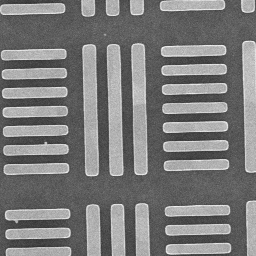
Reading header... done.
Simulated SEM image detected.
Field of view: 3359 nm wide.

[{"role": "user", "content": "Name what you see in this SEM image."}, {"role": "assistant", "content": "groups of lines, slits or small figures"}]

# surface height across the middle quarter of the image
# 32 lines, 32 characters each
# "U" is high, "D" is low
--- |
DDDDDUUUDDDUUUDDDUUUDDDDDDUUUUUU
DDDDDUUUDDDUUUDDDUUUDDDDDUUUUUUU
UDDDDUUUDDDUUUDDDUUUDDDDDUUUUUUU
DDDDDUUUDDDUUUDDDUUUDDDDDDDDDDDD
DDDDDUUUDDDUUUDDDUUUDDDDDDDDDDDD
DDDDDUUUDDDUUUDDDUUUDDDDDUUUUUUU
UDDDDUUUDDDUUUDDDUUUDDDDDUUUUUUU
UDDDDUUUDDDUUUDDDUUUDDDDDUUUDDDD
DDDDDUUUDDDUUUDDDUUUDDDDDDDDDDDD
DDDDDUUUDDDUUUDDDUUUDDDDDDDDDDDD
DDDDDUUUDDDUUUDDDUUUDDDDDUUUUUUU
UDDDDUUUDDDUUUDDDUUUDDDDDUUUUUUU
UDDDDUUUDDDUUUDDDDUUDDDDDDDDDDDD
DDDDDUUUDDDUUUDDDDUUDDDDDDDDDDDD
DDDDDUUUDDDUUUDDDDUUDDDDDDDDDDDD
DDDDDUUUDDDUUUDDDDUUDDDDDUUUUUUU
UDDDDUUUDDDUUUDDDDUUDDDDDUUUUUUU
DDDDDUUUDDDUUUDDDDUUDDDDDDDDDDDD
DDDDDUUUDDDDUUDDDDUUUDDDDDDDDDDD
DDDDDUUUDDDDUUDDDDUUUDDDDDUUUUUU
UDDDDUUUDDDDUUDDDDUUUDDDDUUUUUUU
UDDDDUUUDDDDUUDDDDUUUDDDDUUUUUUU
DDDDDUUUDDDDUUDDDDUUUDDDDDDDDDDD
DDDDDUUUDDDDUUUDDDUUUDDDDDDDDDDD
DDDDDDUUDDDDUUUDDDUUUDDDDUUUUUUU
UDDDDDUUDDDDUUUDDDUUUDDDDUUUUUUU
UDDDDDUUDDDDUUUDDDUUUDDDDDUUDDDD
DDDDDDUUDDDDUUDDDDUUDDDDDDDDDDDD
DDDDDDDDDDDDDDDDDDDDDDDDDDDDDDDD
DDDDDDDDDDDDDDDDDDDDDDDDDDDDDDDD
DDDDDDDDDDDDDDDDDDDDDDDDDDDDDDDD
DDDDDDDDDDDDDDDDDDDDDDDDDDDDDDDD